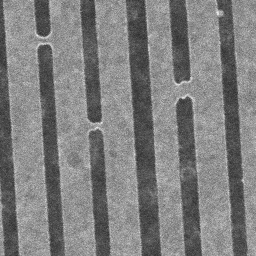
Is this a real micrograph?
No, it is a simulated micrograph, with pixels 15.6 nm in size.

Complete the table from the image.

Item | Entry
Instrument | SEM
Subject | parallel lines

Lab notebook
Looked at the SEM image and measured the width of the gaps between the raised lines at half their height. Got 241 nanometres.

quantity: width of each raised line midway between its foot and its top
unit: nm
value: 471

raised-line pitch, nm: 711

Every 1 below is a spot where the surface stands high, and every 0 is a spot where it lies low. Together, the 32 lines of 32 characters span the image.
01110011110011110011100111100111
01110011110011110011100111110111
01110011110011110011100111100111
01110011110011110011100011100111
01111011110011110001100011100111
01111011110011110001100011100111
01111001110011110001110011100111
01111001110011110001110011110111
01111001110011110001110011110011
01111001111001110001110011110011
01111001111001110001111111110011
01111001111001110001111111110011
01111001111001110001110011110011
01111001111001110001110011110011
01111001111001111001110011110011
01111001111111111001110011110011
00111001111001111001110011110011
00111001111001111001110011110011
00111001111001111001110011110011
00111001111001111001110001110011
00111001111001111000110001110011
00111100111001111000111111110011
00111100111001111000111101110011
00111100111001111001111001111011
00111100111001111000111001111001
00111100111100111000111001111001
00111100111100111000111001111001
00111100111100111000111001111001
00111100111100111000111001111001
00111100111100111000111001111001
00111100111100111100111001111001
00111100111100111100111001111001